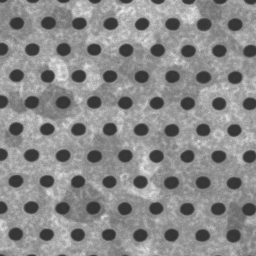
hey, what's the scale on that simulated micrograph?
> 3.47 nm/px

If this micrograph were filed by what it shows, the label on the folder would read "a regular array of holes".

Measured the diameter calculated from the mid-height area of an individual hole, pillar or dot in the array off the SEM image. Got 47.8 nm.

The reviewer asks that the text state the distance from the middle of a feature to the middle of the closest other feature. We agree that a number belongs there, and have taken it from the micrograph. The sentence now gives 105 nanometers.